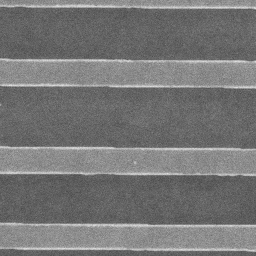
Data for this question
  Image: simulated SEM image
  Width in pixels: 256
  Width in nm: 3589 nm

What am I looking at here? lines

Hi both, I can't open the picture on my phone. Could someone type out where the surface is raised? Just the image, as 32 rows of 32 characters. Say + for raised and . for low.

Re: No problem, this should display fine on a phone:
++++++++++++++++++++++++++++++++
................................
................................
................................
................................
................................
................................
+...............................
++++++++++++++++++++++++++++++++
++++++++++++++++++++++++++++++++
++++++++++++++++++++++++++++++++
................................
................................
................................
................................
................................
................................
................................
+++++++++++++++.................
++++++++++++++++++++++++++++++++
++++++++++++++++++++++++++++++++
++++++++++++++++++++++++++++++++
................................
................................
................................
................................
................................
................................
++++++++++++++++++++++++++++++++
++++++++++++++++++++++++++++++++
++++++++++++++++++++++++++++++++
................................